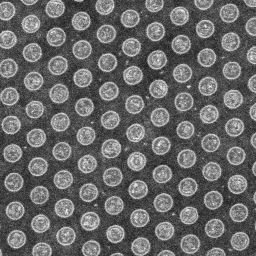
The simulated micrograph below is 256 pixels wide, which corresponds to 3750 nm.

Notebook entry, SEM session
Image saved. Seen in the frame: a regular array of raised bodies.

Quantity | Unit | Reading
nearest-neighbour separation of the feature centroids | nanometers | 415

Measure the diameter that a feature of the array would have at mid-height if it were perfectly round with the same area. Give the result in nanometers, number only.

261